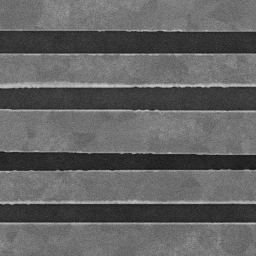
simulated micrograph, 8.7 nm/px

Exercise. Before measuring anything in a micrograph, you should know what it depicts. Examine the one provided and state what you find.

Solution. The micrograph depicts lines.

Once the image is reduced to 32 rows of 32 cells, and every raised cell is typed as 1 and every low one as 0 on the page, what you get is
11111111111111111111111111111111
11111111111111111111111111111111
11111111111111111111111111111111
11111111111111111111111111111111
00000000000000000000000000000000
00000000000000000000000000000000
00000000000000000000000000000000
11111111111111111111111111111111
11111111111111111111111111111111
11111111111111111111111111111111
11111111111111111111111111111111
00000000000000000000000000000000
00000000000000000000000000000000
00000000000000000000000000000000
11111111111111111111111111111111
11111111111111111111111111111111
11111111111111111111111111111111
11111111111111111111111111111111
11111111111111111111111111111111
00000000000000000000000000000000
00000000000000000000000000000000
11111111111111111111111111111111
11111111111111111111111111111111
11111111111111111111111111111111
11111111111111111111111111111111
00000000000000000000000000000000
00000000000000000000000000000000
00000000000000000000000000000000
11111111111111111111111111111111
11111111111111111111111111111111
11111111111111111111111111111111
11111111111111111111111111111111